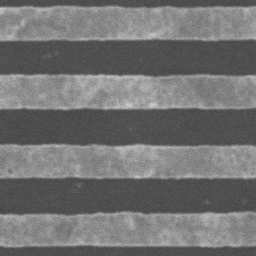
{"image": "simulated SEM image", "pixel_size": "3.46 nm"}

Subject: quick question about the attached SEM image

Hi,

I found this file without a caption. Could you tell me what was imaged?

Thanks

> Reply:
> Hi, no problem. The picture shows lines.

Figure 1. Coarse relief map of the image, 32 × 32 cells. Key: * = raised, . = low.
................................
********************************
********************************
********************************
********************************
................................
................................
................................
................................
................................
********************************
***********.********************
********************************
**********.********......***.**.
................................
................................
................................
................................
********************************
********************************
*.******************************
*.******************************
................................
................................
................................
................................
................................
********************************
********************************
********************.***********
********************************
................................